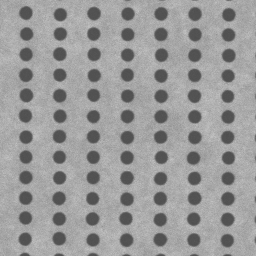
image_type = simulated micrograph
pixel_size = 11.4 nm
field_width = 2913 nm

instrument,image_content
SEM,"a regular array of holes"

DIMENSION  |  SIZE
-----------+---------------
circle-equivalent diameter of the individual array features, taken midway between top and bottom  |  150 nm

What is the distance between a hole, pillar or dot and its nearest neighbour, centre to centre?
20.3 pixels